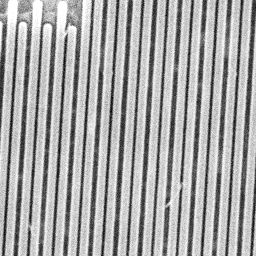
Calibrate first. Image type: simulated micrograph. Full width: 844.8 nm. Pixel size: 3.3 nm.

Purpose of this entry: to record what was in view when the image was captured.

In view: parallel lines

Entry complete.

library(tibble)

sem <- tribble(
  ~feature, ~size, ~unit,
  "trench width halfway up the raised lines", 14.4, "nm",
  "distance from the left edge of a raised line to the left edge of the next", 40.9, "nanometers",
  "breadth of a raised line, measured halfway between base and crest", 26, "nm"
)